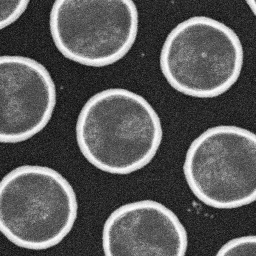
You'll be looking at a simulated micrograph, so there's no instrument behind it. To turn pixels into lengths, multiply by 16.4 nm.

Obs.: raised bodies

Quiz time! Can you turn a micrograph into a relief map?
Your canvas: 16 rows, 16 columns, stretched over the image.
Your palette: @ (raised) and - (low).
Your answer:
@---@@@@--------
---@@@@@----@---
----@@@@---@@@@-
----@@@---@@@@@-
@@@-------@@@@@-
@@@--------@@@--
@@@---@@@-------
@@@--@@@@@------
@@---@@@@@---@@@
-----@@@@---@@@@
-------@----@@@@
@@@@--------@@@@
@@@@@--------@@@
@@@@@--@@@@-----
@@@@---@@@@-----
-------@@@@---@@